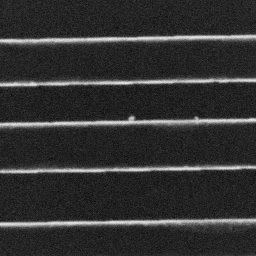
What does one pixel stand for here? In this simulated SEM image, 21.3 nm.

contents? lines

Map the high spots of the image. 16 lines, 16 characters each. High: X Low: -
----------------
----------------
-----XXXXXXXXXXX
XXXXXXXXXXXXXXXX
XXXXXXXXXXXXXXXX
----------------
----------------
----------------
XXXXXXXXXXXXXXXX
XXXXXXXXXXXXXXXX
XXXXXXXXXXXXXXX-
----------------
----------------
----------------
XXXXXXXXXXXXXXXX
XXXXXXXXXXXXXXXX